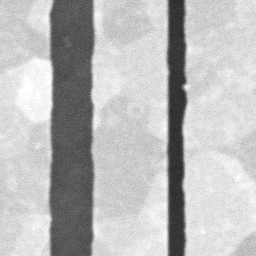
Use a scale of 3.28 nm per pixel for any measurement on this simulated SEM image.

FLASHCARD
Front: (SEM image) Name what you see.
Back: lines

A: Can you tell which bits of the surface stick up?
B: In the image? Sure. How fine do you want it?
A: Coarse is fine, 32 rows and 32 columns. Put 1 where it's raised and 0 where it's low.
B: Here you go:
11111100000011111111100111111111
11111100000011111111100111111111
11111100000011111111100111111111
11111100000011111111100111111111
11111100000011111111100111111111
11111100000011111111100111111111
11111100000011111111100111111111
11111100000011111111100111111111
11111100000011111111100111111111
11111100000011111111100111111111
11111100000011111111100111111111
11111100000011111111100111111111
11111100000011111111100111111111
11111100000011111111100111111111
11111100000011111111100111111111
11111100000011111111100111111111
11111100000011111111100111111111
11111100000011111111100111111111
11111100000111111111100111111111
11111100000011111111100111111111
11111100000011111111100111111111
11111100000011111111100111111111
11111100000011111111100111111111
11111100000011111111100111111111
11111100000011111111100111111111
11111100000011111111100111111111
11111100000011111111100111111111
11111100000011111111100111111111
11111100000011111111100111111111
11111100000011111111100111111111
11111100000011111111100111111111
11111100000011111111100111111111